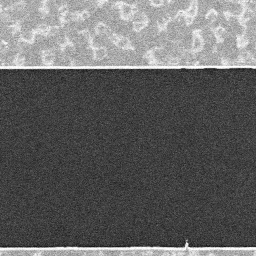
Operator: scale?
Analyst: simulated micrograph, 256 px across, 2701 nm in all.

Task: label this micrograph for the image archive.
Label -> one or a few lines or trenches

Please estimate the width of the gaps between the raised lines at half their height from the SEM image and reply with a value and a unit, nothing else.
1.91 microns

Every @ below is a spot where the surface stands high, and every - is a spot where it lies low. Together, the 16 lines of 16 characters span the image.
@@@@@@@@@@@@@@@@
@@@@@@@@@@@@@@@@
@@@@@@@@@@@@@@@@
@@@@@@@@@@@@@@@@
----------------
----------------
----------------
----------------
----------------
----------------
----------------
----------------
----------------
----------------
----------------
----------------